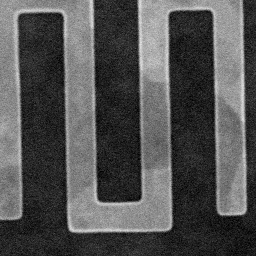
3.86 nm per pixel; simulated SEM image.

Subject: groups of lines, slits or small figures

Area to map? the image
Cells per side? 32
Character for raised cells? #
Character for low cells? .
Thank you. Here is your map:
############.....#############..
###....#####.....####.....####..
##......####.....####......###..
##......####.....####......###..
##......####......###......###..
##......####......###......###..
##......####......###......###..
##......####......###......###..
##......####......###......###..
##......####......###......###..
##......####......###......###..
##......####......###......###..
##......####......###......###..
##......####......###......###..
##......####......###......###..
##......####......###......###..
##......####......###......####.
###.....####......###......####.
###.....####......###......####.
###.....####......###......####.
###.....####......###......####.
###.....####......###......####.
###.....####......###......####.
###.....####......###......####.
###.....####......###......####.
###.....#############......####.
###......############......####.
.........############...........
.........############...........
................................
................................
................................